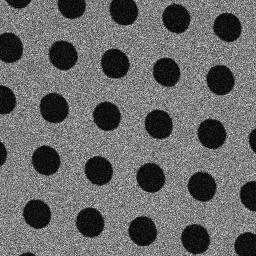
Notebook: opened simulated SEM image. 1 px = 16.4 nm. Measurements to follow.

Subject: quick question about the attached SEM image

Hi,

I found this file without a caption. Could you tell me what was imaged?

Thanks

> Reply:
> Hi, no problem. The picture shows a regular array of holes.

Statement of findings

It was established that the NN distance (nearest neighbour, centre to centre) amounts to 52.5 pixels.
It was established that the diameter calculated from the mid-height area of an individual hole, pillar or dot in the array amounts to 478 nm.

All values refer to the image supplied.